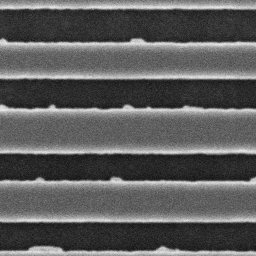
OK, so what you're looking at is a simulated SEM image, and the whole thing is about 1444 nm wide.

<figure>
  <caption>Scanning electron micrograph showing lines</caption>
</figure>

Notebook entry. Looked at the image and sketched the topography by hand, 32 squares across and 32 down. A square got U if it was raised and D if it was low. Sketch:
UUUUUUUUUUUUUUUUUUUUUUUUUUUUUUUU
DDDDDDDDDDDDDDDDDDDDDDDDDDDDDDDD
DDDDDDDDDDDDDDDDDDDDDDDDDDDDDDDD
DDDDDDDDDDDDDDDDDDDDDDDDDDDDDDDD
DDDDDDDDDDDDDDDDDDDDDDDDDDDDDDDD
UUUUUUUUUUUUUUUUUUUUUUUUUUUUUUUU
UUUUUUUUUUUUUUUUUUUUUUUUUUUUUUUU
UUUUUUUUUUUUUUUUUUUUUUUUUUUUUUUU
UUUUUUUUUUUUUUUUUUUUUUUUUUUUUUUU
UUUUUUUUUUUUUUUUUUUUUUUUUUUUUUUU
DDDDDDDDDDDDDDDDDDDDDDDDDDDDDDDD
DDDDDDDDDDDDDDDDDDDDDDDDDDDDDDDD
DDDDDDDDDDDDDDDDDDDDDDDDDDDDDDDD
DDDDDDDDDDDDDDDDDDDDDDDDDDDDDDDD
UUUUUUUUUUUUUUUUUUUUUUUUUUUUUUUU
UUUUUUUUUUUUUUUUUUUUUUUUUUUUUUUU
UUUUUUUUUUUUUUUUUUUUUUUUUUUUUUUU
UUUUUUUUUUUUUUUUUUUUUUUUUUUUUUUU
UUUUUUUUUUUUUUUUUUUUUUUUUUUUUUUU
DDDDDDDDDDDDDDDDDDDDDDDDDDDDDDDD
DDDDDDDDDDDDDDDDDDDDDDDDDDDDDDDD
DDDDDDDDDDDDDDDDDDDDDDDDDDDDDDDD
DDDDDDDDDDDDDDDDDDDDDDDDDDDDDDDD
UUUUUUUUUUUUUUUUUUUUUUUUUUUUUUUU
UUUUUUUUUUUUUUUUUUUUUUUUUUUUUUUU
UUUUUUUUUUUUUUUUUUUUUUUUUUUUUUUU
UUUUUUUUUUUUUUUUUUUUUUUUUUUUUUUU
UUUUUUUUUUUUUUUUUUUUUUUUUUUUUUUU
DDDDDDDDDDDDDDDDDDDDDDDDDDDDDDDD
DDDDDDDDDDDDDDDDDDDDDDDDDDDDDDDD
DDDDDDDDDDDDDDDDDDDDDDDDDDDDDDDD
UUUUUUUUUUUUUUUUUUUUUDUUUUUUUUDU